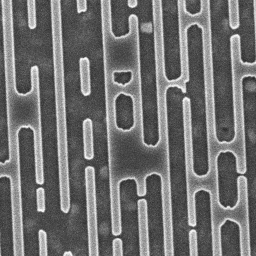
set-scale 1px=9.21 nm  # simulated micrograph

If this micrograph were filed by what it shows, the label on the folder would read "parallel lines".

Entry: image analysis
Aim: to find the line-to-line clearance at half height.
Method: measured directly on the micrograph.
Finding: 155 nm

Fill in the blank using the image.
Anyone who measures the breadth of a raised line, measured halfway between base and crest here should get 73.6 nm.